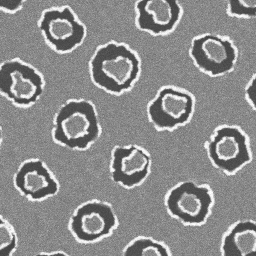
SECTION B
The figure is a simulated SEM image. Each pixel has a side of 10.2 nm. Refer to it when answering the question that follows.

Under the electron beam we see a regular array of ring-shaped grooves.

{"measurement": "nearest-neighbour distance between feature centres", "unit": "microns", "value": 0.691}